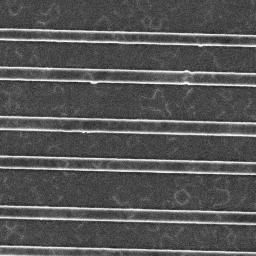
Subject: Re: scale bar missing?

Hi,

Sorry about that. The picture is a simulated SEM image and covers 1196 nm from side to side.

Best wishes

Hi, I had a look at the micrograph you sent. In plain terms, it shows parallel lines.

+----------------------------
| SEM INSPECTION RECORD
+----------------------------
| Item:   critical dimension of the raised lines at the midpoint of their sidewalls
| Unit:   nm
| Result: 57.8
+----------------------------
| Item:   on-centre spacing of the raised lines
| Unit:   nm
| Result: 207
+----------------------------